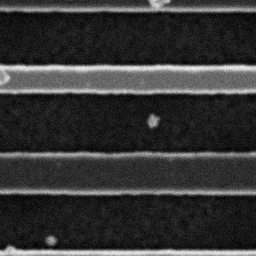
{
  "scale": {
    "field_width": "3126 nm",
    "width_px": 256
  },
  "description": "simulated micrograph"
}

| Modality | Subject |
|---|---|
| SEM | lines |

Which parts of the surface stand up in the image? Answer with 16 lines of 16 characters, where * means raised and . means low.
****************
................
................
................
****************
****************
................
................
................
................
****************
****************
................
................
................
................